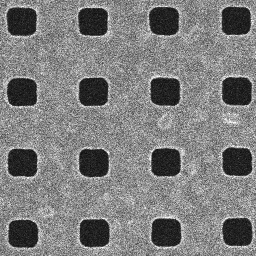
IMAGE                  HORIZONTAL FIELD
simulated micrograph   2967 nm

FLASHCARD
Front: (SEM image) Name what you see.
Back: a regular array of holes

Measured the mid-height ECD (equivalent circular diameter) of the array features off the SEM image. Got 0.364 um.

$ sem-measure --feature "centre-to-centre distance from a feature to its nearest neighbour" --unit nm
814